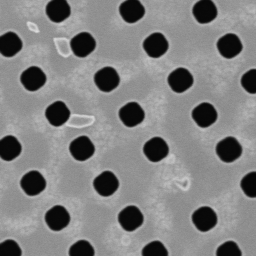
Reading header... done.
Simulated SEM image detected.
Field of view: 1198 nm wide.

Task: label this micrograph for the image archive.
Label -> a regular array of holes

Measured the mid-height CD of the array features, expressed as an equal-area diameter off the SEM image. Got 0.112 µm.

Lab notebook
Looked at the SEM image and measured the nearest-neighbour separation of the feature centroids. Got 199 nm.